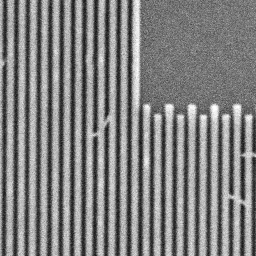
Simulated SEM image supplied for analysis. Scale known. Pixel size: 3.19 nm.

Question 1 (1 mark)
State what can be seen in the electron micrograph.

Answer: parallel lines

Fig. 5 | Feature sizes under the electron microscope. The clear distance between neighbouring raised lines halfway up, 0.018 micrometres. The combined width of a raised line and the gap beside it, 36.2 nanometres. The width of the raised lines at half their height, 18.4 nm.